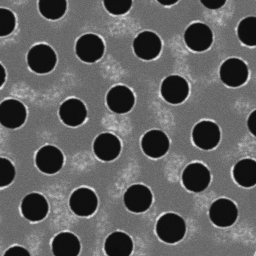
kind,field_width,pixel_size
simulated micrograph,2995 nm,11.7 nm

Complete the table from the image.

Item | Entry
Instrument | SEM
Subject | a regular array of holes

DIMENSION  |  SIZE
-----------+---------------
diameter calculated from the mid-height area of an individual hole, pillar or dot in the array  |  0.336 um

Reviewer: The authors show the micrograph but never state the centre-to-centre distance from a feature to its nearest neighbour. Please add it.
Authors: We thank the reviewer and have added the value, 575 nm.